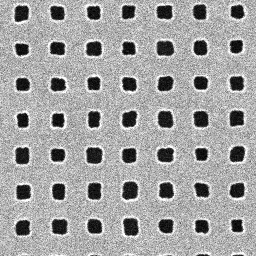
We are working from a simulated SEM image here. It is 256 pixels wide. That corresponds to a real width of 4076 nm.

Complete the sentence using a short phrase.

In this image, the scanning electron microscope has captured a regular array of holes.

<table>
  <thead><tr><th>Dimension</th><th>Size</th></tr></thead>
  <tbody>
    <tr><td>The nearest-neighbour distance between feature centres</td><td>35.3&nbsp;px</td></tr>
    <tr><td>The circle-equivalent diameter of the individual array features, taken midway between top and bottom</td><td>252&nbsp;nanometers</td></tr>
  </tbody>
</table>